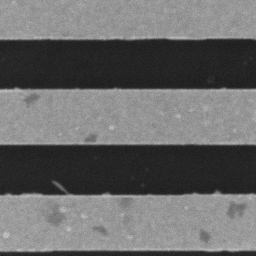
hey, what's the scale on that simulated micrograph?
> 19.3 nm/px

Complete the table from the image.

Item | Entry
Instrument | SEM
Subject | lines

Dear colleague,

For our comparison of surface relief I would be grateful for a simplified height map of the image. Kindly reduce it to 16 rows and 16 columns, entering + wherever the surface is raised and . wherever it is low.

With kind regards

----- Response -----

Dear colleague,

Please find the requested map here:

++++++++++++++++
++++++++++++++++
................
................
................
................
++++++++++++++++
++++++++++++++++
++++++++++++++++
................
................
................
++++++++++++++++
++++++++++++++++
++++++++++++++++
++++++++++++++++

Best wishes